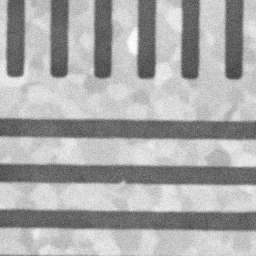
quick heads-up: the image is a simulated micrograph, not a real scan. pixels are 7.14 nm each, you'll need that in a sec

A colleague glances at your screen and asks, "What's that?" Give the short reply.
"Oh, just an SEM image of groups of lines, slits or small figures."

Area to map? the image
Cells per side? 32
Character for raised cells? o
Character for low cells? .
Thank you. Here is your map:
o..ooo...ooo..ooo...ooo..ooo...o
o..ooo...ooo..ooo...ooo..ooo...o
o..ooo...ooo..ooo...ooo..ooo..oo
o..ooo...ooo..ooo...ooo..ooo..oo
o..ooo...ooo..ooo...ooo..ooo...o
o..ooo...ooo..ooo...ooo..ooo...o
o..ooo...ooo..ooo...ooo..ooo..oo
o..ooo...ooo..ooo...ooo..ooo..oo
o..ooo...ooo..ooo...ooo..ooo..oo
o..oooo.oooo..ooo..oooo..ooo..oo
oooooooooooooooooooooooooooooooo
oooooooooooooooooooooooooooooooo
oooooooooooooooooooooooooooooooo
oooooooooooooooooooooooooooooooo
oooooooooooooooooooooooooooooooo
................................
................................
oooooooooooooooooooo............
oooooooooooooooooooooooooooooooo
oooooooooooooooooooooooooooooooo
.........ooooooooooooooooooooooo
................................
................................
oooooooooooooooooooooooooooooooo
oooooooooooooooooooooooooooooooo
oooooooooooooooooooooooooooooooo
................................
................................
................................
oooooooooooooooooooooooooooooooo
oooooooooooooooooooooooooooooooo
oooooooooooooooooooooooooooooooo